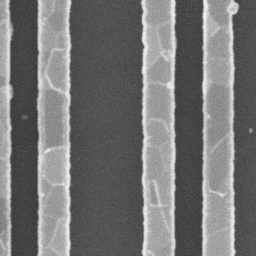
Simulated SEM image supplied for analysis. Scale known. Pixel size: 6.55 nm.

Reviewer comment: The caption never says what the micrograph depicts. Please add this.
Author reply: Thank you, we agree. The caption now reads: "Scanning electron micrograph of lines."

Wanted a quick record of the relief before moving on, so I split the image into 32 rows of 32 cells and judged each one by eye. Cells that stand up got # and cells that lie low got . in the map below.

#....####.........####....####..
#....####.........####....###...
#....####.........####....###...
#....####.........####....###...
#....####.........####....###...
#....####.........####....###...
#....####.........####....###...
#....####.........####....###...
#....####.........####....###...
#....####.........####....###...
#....####.........####...####...
#....####.........####....###...
#....####.........####....###...
#....####.........####...####...
#....####.........####....###...
#....####.........####....###...
#....####.........####....###...
#....####.........####....###...
#....####.........####....###...
#....####.........####....###...
#....####.........####...####...
#....####.........####...####...
#....####.........####....###...
#....####.........####...####...
#....####.........####...####...
#....####.........####....###...
#....####.........####...####...
#....####.........####...####...
#....####.........####...####...
#....####.........####...####...
#....####.........####...####...
#....####.........####...####...